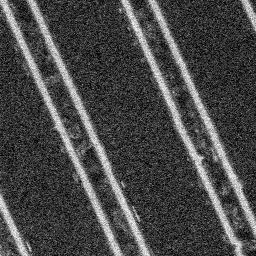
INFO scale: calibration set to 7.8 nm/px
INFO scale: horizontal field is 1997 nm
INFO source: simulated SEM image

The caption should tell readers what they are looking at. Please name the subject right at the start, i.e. one or a few lines or trenches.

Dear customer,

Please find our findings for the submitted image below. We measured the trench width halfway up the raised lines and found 663 nanometers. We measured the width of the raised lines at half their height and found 198 nanometers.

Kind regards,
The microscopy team